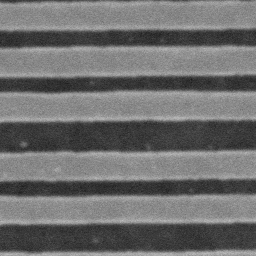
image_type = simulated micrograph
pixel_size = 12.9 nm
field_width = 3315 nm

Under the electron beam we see lines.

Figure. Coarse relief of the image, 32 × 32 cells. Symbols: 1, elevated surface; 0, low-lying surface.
11111111111111111111111111111111
11111111111111111111111111111111
11111111111111111111111111111111
11111111111111111111111111111111
00000000000000000000000000000000
00000000000000000000000000000000
11111111111111111111111111111111
11111111111111111111111111111111
11111111111111111111111111111111
00000011000000000000000000000000
00000000000000000000000000000000
00000000000000000000000000000000
11111111111111111111111111111111
11111111111111111111111111111111
11111111111111111111111111111111
00000000000000000000000000000000
00000000000000000000000000000000
00000000000000000000000000000000
00000000000000000000000000000000
11111111111111111111111111111111
11111111111111111111111111111111
11111111111111111111111111111111
00000000000000000000000000000000
00000000000000000000000000000000
00000000000000000000000001100000
11111111111111111111111111111111
11111111111111111111111111111111
11111111111111111111111111111111
00000000000000000000000000000000
00000000000000000000000000000000
00000000000000000000000000000000
00000000000000000000000000000000